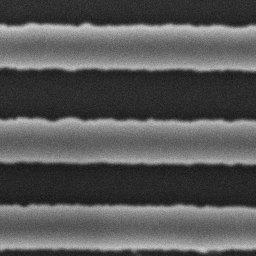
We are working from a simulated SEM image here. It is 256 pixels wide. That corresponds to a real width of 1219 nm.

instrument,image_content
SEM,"lines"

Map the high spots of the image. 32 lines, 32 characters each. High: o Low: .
................................
................................
................................
oooooooooooooooooooooooooooooooo
oooooooooooooooooooooooooooooooo
oooooooooooooooooooooooooooooooo
oooooooooooooooooooooooooooooooo
oooooooooooooooooooooooooooooooo
..oooo.oooo.oooooooooooooooooooo
................................
................................
................................
................................
................................
................................
oooooooooooooooooooooooooooooooo
oooooooooooooooooooooooooooooooo
oooooooooooooooooooooooooooooooo
oooooooooooooooooooooooooooooooo
oooooooooooooooooooooooooooooooo
.......................o....o..o
................................
................................
................................
................................
................................
oooooooooooooooooooooooooooooooo
oooooooooooooooooooooooooooooooo
oooooooooooooooooooooooooooooooo
oooooooooooooooooooooooooooooooo
oooooooooooooooooooooooooooooooo
................................